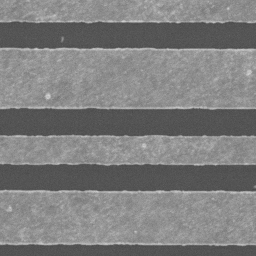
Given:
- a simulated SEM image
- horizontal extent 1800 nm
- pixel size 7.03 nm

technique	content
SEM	lines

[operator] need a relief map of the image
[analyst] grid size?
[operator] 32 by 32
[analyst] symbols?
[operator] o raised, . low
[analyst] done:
oooooooooooooooooooooooooooooooo
oooooooooooooooooooooooooooooooo
oooooooooooooooooooooooooooooooo
................................
................................
................................
oooooooooooooooooooooooooooooooo
oooooooooooooooooooooooooooooooo
oooooooooooooooooooooooooooooooo
oooooooooooooooooooooooooooooooo
oooooooooooooooooooooooooooooooo
oooooooooooooooooooooooooooooooo
oooooooooooooooooooooooooooooooo
ooooooooooo.oooooooooooo.ooooooo
................................
................................
................................
oooooooooooooooooooooooooooooooo
oooooooooooooooooooooooooooooooo
oooooooooooooooooooooooooooooooo
.............oo.........oo......
................................
................................
................................
oooooooooooooooooooooooooooooooo
oooooooooooooooooooooooooooooooo
oooooooooooooooooooooooooooooooo
oooooooooooooooooooooooooooooooo
oooooooooooooooooooooooooooooooo
oooooooooooooooooooooooooooooooo
oooooooooooooo..oooooooooooooooo
................................